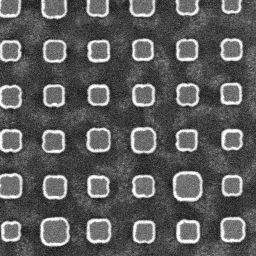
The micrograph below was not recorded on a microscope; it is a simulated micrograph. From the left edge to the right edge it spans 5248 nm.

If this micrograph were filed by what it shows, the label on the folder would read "a regular array of raised bodies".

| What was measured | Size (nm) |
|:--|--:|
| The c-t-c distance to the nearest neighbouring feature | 905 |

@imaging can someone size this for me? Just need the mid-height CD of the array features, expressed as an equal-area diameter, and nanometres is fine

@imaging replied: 458